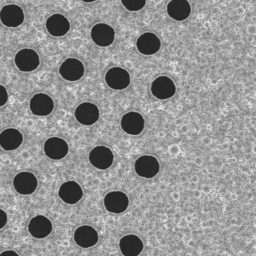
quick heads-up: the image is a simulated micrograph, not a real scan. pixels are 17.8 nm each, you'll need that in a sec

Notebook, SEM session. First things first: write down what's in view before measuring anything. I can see a regular array of holes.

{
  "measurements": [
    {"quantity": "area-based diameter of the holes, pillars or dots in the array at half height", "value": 0.424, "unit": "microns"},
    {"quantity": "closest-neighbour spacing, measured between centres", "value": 818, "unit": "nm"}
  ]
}